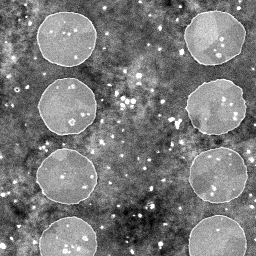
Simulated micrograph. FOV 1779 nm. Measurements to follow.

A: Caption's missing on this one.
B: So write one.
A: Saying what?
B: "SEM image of raised bodies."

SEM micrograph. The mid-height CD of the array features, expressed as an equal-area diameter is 396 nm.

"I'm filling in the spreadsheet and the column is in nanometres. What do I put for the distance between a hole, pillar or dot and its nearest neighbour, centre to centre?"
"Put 474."